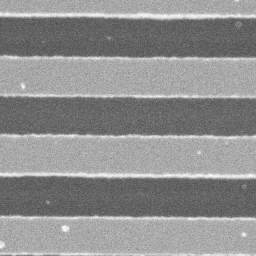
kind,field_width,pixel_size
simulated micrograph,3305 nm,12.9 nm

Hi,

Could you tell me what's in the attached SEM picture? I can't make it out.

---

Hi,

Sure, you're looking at lines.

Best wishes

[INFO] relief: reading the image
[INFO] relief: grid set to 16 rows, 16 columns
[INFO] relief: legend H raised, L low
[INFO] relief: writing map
HHHHHHHHHHHHHHHH
LLLLLLLLLLLLLLLL
LLLLLLLLLLLLLLLL
LLLLLLLLLLLLLLLL
HHHHHHHHHHHHHHHH
HHHHHHHHHHHHHHHH
LLLLLLLLLLLLLLLL
LLLLLLLLLLLLLLLL
HHHHHLLLLLLLLLLL
HHHHHHHHHHHHHHHH
HHHHHHHHHHHHHHHH
LLLLLLLLLLLLLLLL
LLLLLLLLLLLLLLLL
LLLLLLLLLLLLLLLL
HHHHHHHHHHHHHHHH
HHHHHHHHHHHHHHHH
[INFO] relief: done